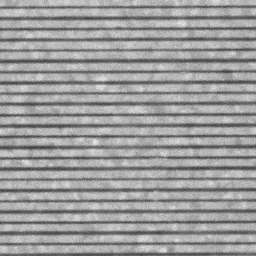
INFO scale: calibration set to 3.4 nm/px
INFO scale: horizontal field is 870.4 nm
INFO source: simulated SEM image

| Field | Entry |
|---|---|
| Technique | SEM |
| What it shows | parallel lines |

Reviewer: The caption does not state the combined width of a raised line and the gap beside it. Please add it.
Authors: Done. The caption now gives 36.6 nm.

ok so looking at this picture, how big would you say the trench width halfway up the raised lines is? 9.8 nanometres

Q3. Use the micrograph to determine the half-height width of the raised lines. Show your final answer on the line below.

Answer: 25.9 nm